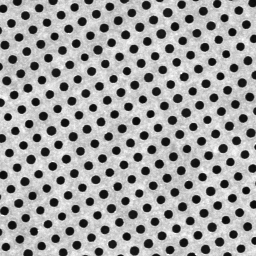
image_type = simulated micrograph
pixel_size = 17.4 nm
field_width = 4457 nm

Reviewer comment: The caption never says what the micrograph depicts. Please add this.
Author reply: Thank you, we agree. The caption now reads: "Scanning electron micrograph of a regular array of holes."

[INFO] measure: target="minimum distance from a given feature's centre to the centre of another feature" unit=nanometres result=272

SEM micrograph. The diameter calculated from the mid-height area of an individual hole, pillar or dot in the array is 156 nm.